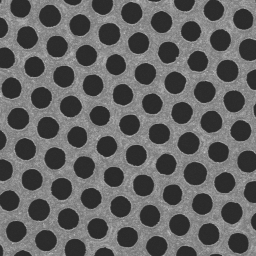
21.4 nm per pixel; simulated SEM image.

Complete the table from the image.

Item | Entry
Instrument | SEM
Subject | a regular array of holes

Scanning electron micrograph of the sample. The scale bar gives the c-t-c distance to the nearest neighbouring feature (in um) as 0.659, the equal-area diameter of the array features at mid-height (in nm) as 461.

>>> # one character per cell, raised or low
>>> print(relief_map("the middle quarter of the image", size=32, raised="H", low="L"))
LHHHHLHHHHLLLLLLHHHLLLHHHHHHHHHL
LLHHHHHHHHHLLLLHHHLLLLLHHHHHHHHH
LLLHHHHHHHHHLLHHHHLLLLLHHHLLLHHH
LLLHHLLLLHHHHHHHHHLLLLLHHLLLLLHH
LLHHHLLLLLHHHHHHHHHLLLHHHLLLLLLH
LHHHHLLLLLHHHLLLHHHHHHHHHLLLLLHH
HHHHHLLLLLHHLLLLLHHHHHHHHHLLLLHH
HHHHHHLLLHHHLLLLLHHHHLLHHHHLHHHH
LLLHHHHHHHHHLLLLLHHHLLLLHHHHHHHH
LLLLHHHHHHHHHLLLLHHLLLLLLHHHHLHH
LLLLLHHHHHHHHHHHHHHHLLLLLHHLLLLL
LLLLHHHLLLLHHHHHHHHHLLLLHHHLLLLL
LLLLHHLLLLLHHHHHHHHHHLLHHHHLLLLL
HHHHHHHLLLLHHHHLLLHHHHHHHHHLLLLL
HHHHHHHLLLLHHHLLLLLHHHHHHHHHLLLH
HHHHHHHHHHHHHHLLLLLHHHLLLLHHHHHH
HHLLLHHHHHHHHHLLLLLHHLLLLLHHHHHH
HLLLLLHHHHHHHHHLLLHHHLLLLLLHHHLL
HLLLLLHHHLLLHHHHHHHHHLLLLLHHHLLL
HLLLLLHHLLLLLHHHHHHHHHLLLLHHLLLL
HHLLLHHHLLLLLHHHHLLHHHHHHHHHLLLL
HHHHHHHHLLLLLHHHLLLLHHHHHHHHHLLL
HHHHHHHHHLLLHHHLLLLLLHHHHLHHHHLL
HHHHLLLHHHHHHHHLLLLLLHHHLLLLHHHH
HHHLLLLLHHHHHHHHLLLLHHHLLLLLHHHH
HHLLLLLLHHHHHHHHHLLHHHHLLLLLHHHL
HHHLLLLLHHLLLLHHHHHHHHHLLLLLHHLL
HHHLLLLHHHLLLLLHHHHHHHHHLLLHHHLL
HHHHLLHHHHLLLLLHHHLLLLHHHHHHHHLL
LLHHHHHHHHLLLLLHHLLLLLHHHHHHHHHL
LLHHHHHHHHHLLLHHHLLLLLLHHHLLLHHH
LLHHHLLLHHHHHHHHHLLLLLHHHLLLLHHH